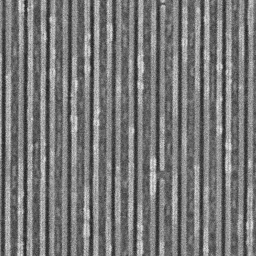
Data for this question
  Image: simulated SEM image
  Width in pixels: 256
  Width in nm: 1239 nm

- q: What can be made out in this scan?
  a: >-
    parallel lines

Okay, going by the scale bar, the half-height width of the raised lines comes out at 18.1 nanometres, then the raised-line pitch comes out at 53.3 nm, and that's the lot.